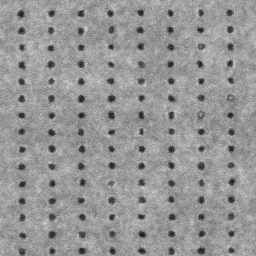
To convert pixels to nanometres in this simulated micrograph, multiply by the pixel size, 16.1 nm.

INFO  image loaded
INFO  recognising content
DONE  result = a regular array of holes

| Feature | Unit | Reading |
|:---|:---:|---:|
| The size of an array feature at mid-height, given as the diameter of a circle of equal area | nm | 126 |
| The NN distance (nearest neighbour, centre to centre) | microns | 0.27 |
